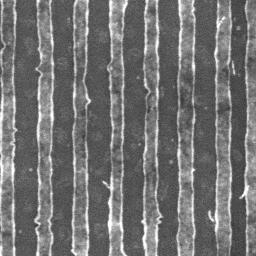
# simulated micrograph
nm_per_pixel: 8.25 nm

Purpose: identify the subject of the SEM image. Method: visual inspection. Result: parallel lines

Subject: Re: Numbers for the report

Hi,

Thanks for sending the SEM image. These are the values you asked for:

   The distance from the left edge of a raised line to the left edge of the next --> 35.8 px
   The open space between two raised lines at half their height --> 178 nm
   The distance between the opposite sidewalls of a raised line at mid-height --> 111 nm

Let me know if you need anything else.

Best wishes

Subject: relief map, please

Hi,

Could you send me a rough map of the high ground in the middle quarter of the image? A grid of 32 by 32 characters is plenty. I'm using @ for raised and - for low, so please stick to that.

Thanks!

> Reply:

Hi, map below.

---@@@-----@@@@-----@@@------@@@
---@@------@@@@-----@@@------@@@
---@@-------@@@-----@@@------@@@
---@@-------@@@-----@@@@----@@@@
---@@-------@@@-----@@@------@@@
--@@@-------@@@------@@------@@@
--@@@@------@@@------@@------@@@
--@@@@------@@@------@@------@@@
--@@@@------@@@------@@------@@@
--@@@@------@@@------@@------@@@
--@@@@------@@@------@@------@@@
---@@@------@@@------@@------@@@
---@@@------@@@------@@------@@@
---@@@------@@@------@@-----@@@@
---@@@------@@@------@@-----@@@@
--@@@@------@@@------@@------@@@
--@@@@------@@@------@@------@@@
--@@@@------@@@-----@@@------@@@
--@@@@------@@@-----@@@------@@@
--@@@-------@@@-----@@@------@@@
--@@@-------@@------@@@------@@@
--@@@@------@@@-----@@@------@@@
---@@@------@@@-----@@@------@@@
---@@@------@@@-----@@@------@@@
---@@@------@@@-----@@@------@@@
---@@@------@@@-----@@@------@@@
---@@@------@@@-----@@@------@@@
---@@@------@@@-----@@@------@@@
---@@@------@@@-----@@@------@@@
---@@@------@@------@@@------@@@
---@@@------@@------@@@------@@@
---@@@------@@------@@@------@@@